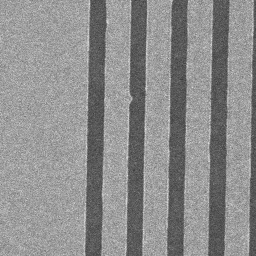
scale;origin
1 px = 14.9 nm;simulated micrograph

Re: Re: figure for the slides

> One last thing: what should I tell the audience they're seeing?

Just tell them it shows parallel lines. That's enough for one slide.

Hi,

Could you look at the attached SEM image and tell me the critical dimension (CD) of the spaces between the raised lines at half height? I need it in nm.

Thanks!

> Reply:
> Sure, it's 259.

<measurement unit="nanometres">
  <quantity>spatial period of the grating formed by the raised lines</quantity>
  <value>611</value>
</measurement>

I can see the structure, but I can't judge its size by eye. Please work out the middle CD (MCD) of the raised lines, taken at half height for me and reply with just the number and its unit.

0.356 um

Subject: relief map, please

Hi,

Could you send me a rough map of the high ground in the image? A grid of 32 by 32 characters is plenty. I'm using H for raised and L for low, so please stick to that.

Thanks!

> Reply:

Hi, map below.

HHHHHHHHHHHLLHHHLLLHHHLLHHLLLHHH
HHHHHHHHHHHLLHHHLLLHHLLHHHLLLHHH
HHHHHHHHHHHLLHHHLLHHHLLHHHLLLHHH
HHHHHHHHHHHLLHHHLLHHHLLLHHLLLHHH
HHHHHHHHHHHLLHHHLLHHHLLLHHLLLHHH
HHHHHHHHHHHLLHHHLLHHHLLHHHLLLHHH
HHHHHHHHHHHLLHHHLLHHHLLHHHLLLHHH
HHHHHHHHHHHLLHHHLLHHHLLHHHLLLHHL
HHHHHHHHHHHLLHHHLLHHHLLHHHLLLHHL
HHHHHHHHHHHLLHHHLLHHHLLHHHLLLHHL
HHHHHHHHHHHLLHHHLLHHHLLHHHLLLHHL
HHHHHHHHHHHLLHHHLLHHHLLHHHLLLHHL
HHHHHHHHHHHLLHHHLLHHHLLHHHLLHHHL
HHHHHHHHHHHLLHHHLLHHHLLHHHLLHHHL
HHHHHHHHHHHLLHHHLLHHHLLHHHLLHHHL
HHHHHHHHHHHLLHHHLLHHHLLHHHLLHHHL
HHHHHHHHHHHLLHHHLLHHHLLHHHLLHHHL
HHHHHHHHHHHLLHHHLLHHHLLHHHLLHHHL
HHHHHHHHHHHLLHHHLLHHHLLHHHLLHHHL
HHHHHHHHHHHLLHHHLLHHHLLHHHLLHHHL
HHHHHHHHHHHLLHHHLLHHHLLHHHLLHHHL
HHHHHHHHHHHLLHHHLLHHHLLHHHLLHHHL
HHHHHHHHHHHLLHHHLLHHHLLHHHLLHHHL
HHHHHHHHHHHLLHHHLLHHHLLHHHLLHHHL
HHHHHHHHHHHLLHHHLLHHHLLHHHLLHHHL
HHHHHHHHHHHLLHHHLLHHHLLHHHLLHHHL
HHHHHHHHHHHLLHHHLLHHHLLHHHLLHHHL
HHHHHHHHHHHLLHHHLLHHHLLHHHLLHHHL
HHHHHHHHHHHLLHHHLLHHHLLHHHLLHHHL
HHHHHHHHHHHLLHHHLLHHHLLHHHLLHHHL
HHHHHHHHHHHLLHHHLLHHHLLHHHLLHHHL
HHHHHHHHHHHLLHHHLLHHHLLHHHLLHHHL